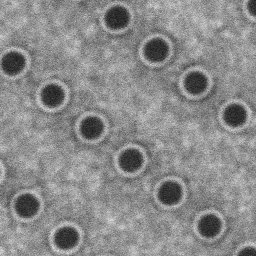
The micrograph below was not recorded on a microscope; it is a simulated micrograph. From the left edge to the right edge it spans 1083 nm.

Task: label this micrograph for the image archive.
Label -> a regular array of raised bodies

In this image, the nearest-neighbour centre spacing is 215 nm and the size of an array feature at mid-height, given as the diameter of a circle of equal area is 128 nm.